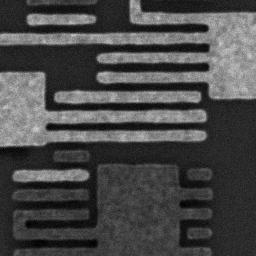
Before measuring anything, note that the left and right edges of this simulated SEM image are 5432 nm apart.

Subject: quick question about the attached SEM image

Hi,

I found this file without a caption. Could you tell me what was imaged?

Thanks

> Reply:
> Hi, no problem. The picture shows wiring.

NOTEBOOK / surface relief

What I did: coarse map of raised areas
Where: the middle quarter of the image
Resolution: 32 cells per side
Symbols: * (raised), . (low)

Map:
................................
................................
.........***********************
........************************
..........**....................
................................
................................
********************************
********************************
.***............................
................................
................................
********************************
********************************
***************.......*********.
................................
................................
********************************
********************************
................................
................................
................................
******..........................
******..........................
................................
...........****.....****........
.****....*******************....
******...*******************...*
******...*******************...*
.........*******************....
.........********************...
....*....***********************